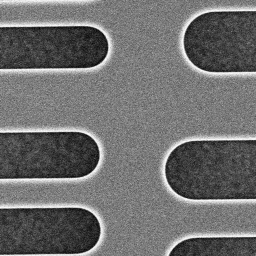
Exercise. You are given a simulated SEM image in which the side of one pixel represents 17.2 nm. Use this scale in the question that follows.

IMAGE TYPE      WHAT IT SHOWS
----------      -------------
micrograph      groups of lines, slits or small figures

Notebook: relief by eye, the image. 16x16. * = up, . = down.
****************
************....
.......****.....
.......*****....
*************...
****************
****************
****************
......**********
......*****.....
......****......
***********.....
************...*
......**********
......**********
......*****.....